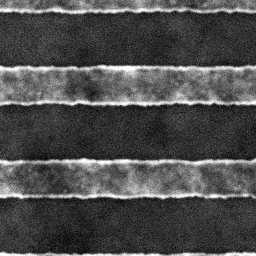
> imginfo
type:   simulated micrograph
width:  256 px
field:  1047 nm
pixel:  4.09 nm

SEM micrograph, lines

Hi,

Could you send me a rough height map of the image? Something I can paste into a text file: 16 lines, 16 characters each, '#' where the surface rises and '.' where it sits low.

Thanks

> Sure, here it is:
################
................
................
................
################
################
.#....####.....#
................
................
................
################
################
................
................
................
................